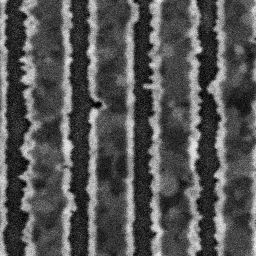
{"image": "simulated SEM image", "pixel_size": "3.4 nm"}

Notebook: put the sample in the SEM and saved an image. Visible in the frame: one or a few lines or trenches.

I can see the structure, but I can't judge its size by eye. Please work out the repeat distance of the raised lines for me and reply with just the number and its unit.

216 nm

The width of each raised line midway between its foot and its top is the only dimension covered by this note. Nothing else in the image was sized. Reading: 132 nm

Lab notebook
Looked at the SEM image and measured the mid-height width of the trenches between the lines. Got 24.5 pixels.